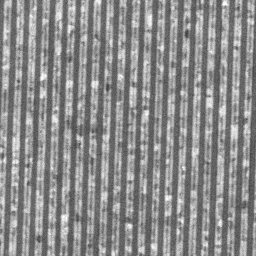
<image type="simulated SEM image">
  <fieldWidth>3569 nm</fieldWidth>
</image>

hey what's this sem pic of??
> parallel lines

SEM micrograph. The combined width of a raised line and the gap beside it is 12.8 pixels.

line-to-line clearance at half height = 115 nanometres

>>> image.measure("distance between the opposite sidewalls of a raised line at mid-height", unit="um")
0.0644